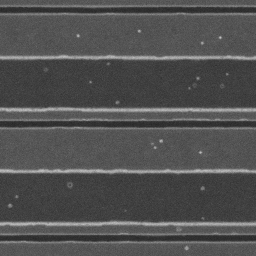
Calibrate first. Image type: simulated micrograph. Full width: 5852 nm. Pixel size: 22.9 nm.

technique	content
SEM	lines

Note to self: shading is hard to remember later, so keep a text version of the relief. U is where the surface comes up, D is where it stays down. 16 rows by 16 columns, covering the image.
UUUUUUUUUUUUUUUU
UUUUUUUUUUUUUUUU
UUUUUUUUUUUUUUUU
UUUUUUUUUUUUUUUU
DDDDDDDDDDDDDDDD
DDDDDDDDDDDDDDDD
DDDDDDDDDDDDDDDD
UUUUUUUUUUUUUUUU
UUUUUUUUUUUUUUUU
UUUUUUUUUUUUUUUU
UUUUUUUUUUUUUUUU
DDDDDDDDDDDDDDDD
DDDDDDDDDDDDDDDD
DDDDDDDDDDDDDDDD
UUUUUUUUUUUUUUUU
UUUUUUUUUUUUUUUU